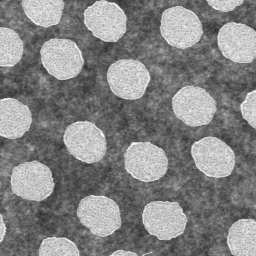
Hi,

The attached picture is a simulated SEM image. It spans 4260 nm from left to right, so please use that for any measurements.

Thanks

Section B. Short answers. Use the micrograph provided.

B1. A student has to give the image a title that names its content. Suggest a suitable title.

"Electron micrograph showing a regular array of raised bodies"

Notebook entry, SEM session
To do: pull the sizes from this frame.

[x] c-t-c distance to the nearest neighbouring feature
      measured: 64.2 px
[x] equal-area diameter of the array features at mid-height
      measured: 674 nm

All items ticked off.